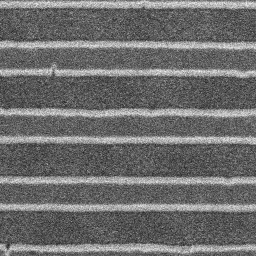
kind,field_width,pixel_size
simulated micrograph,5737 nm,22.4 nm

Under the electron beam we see one or a few lines or trenches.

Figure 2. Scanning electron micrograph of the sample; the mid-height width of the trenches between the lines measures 857 nanometres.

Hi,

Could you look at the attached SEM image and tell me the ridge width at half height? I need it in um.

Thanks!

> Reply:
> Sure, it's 0.658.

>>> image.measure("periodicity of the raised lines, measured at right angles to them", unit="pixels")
67.6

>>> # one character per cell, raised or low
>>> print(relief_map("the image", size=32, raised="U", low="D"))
UUUUUUUUUUUUUUUUUUUUUUUUUUUUUUUU
DDDDDDDDDDDDDDDDDDDDDDDDDDDDDDDD
DDDDDDDDDDDDDDDDDDDDDDDDDDDDDDDD
DDDDDDDDDDDDDDDDDDDDDDDDDDDDDDDD
DDDDDDDDDDDDDDDDDDDDDDDDDDDDDDDD
UUDDUUUUUUUUUUUUUUUUUDDDDDDDDDDD
UUUUUUUUUUUUUUUUUUUUUUUUUUUUUUUU
UUUUUUUUUUUUUUUUUUUUUUUUUUUUUUUU
UUUUUUUUUUUUUUUUUUUUUUUUUUUUUUUU
DDDDDDDDDDDDDDDDDDDDDDDDDDDDDDDD
DDDDDDDDDDDDDDDDDDDDDDDDDDDDDDDD
DDDDDDDDDDDDDDDDDDDDDDDDDDDDDDDD
DDDDDDDDDDDDDDDDDDDDDDDDDDDDDDDD
DDDDDDDDDDDDDDDDDDDDDDDDDDDDDDDD
UUUUUUUUUUUUUUUUUUUUUUUUUUUUUUUU
UUUUUUUUUUUUUUUUUUUUUUUUUUUUUUUU
UUUUUUUUUUUUUUUUUUUUUUUUUUUUUUUU
UUUUUDUUUUUUUUUUUUUUUUUUUUUUUUUU
DDDDDDDDDDDDDDDDDDDDDDDDDDDDDDDD
DDDDDDDDDDDDDDDDDDDDDDDDDDDDDDDD
DDDDDDDDDDDDDDDDDDDDDDDDDDDDDDDD
DDDDDDDDDDDDDDDDDDDDDDDDDDDDDDDD
UUUUUUUUUDUUUUUDDDDDDDDDDDUUDUUU
UUUUUUUUUUUUUUUUUUUUUUUUUUUUUUUU
UUUUUUUUUUUUUUUUUUUUUUUUUUUUUUUU
UUUUUUUUUUUUUUUUUUUUUUUUUUUUUUUU
DDDDDDDDDDDDDDDDDDDDDDDDDDDDDDDD
DDDDDDDDDDDDDDDDDDDDDDDDDDDDDDDD
DDDDDDDDDDDDDDDDDDDDDDDDDDDDDDDD
DDDDDDDDDDDDDDDDDDDDDDDDDDDDDDDD
DDDDDDDDDDDDDDDDDDDDDDDDDDDDDDDD
UUUUUUUUUUUUUUUUUUUUUUUUUUUUUUUU